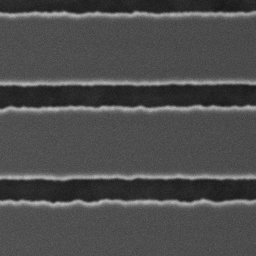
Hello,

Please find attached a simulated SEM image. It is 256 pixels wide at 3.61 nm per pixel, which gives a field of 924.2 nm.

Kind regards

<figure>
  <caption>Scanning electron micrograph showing lines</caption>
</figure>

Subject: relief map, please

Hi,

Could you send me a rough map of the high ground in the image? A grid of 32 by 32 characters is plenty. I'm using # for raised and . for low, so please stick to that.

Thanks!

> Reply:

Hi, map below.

................................
....#..........................#
################################
################################
################################
################################
################################
################################
################################
################################
#####################.#####....#
................................
................................
.###.#############.#############
################################
################################
################################
################################
################################
################################
################################
################################
.......#........................
................................
................................
################################
################################
################################
################################
################################
################################
################################